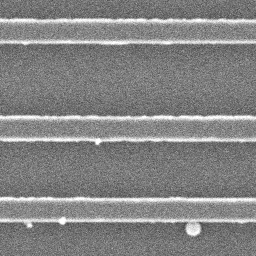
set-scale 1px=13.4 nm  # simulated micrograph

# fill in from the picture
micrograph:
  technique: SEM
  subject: lines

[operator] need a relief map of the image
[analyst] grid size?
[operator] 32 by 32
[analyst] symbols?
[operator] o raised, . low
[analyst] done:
................................
................................
ooooo..ooooooooooooo.o..o..o....
oooooooooooooooooooooooooooooooo
oooooooooooooooooooooooooooooooo
................................
................................
................................
................................
................................
................................
................................
................................
................................
................................
oooooooooooooooooooooooooooooooo
oooooooooooooooooooooooooooooooo
oooooooooo.oooo.oo.ooooooooooooo
................................
................................
................................
................................
................................
................................
................................
oooooooooooooooooooooooooooooooo
oooooooooooooooooooooooooooooooo
oooooooooooooooooooooooooooooooo
........................o.......
................................
................................
................................